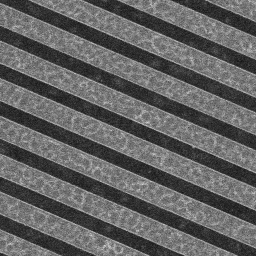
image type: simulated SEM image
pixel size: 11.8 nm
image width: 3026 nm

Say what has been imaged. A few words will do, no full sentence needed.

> parallel lines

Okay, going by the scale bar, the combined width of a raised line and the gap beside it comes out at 34.7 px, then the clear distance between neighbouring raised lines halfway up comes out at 170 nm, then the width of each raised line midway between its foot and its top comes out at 244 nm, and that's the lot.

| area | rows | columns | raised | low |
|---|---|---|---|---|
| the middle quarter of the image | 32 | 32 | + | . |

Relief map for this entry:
........+++++++++++++.........++
+.........+++++++++++++.........
+++.........+++++++++++++.......
+++++..........+++++++++++++....
++++++++.........+++++++++++++..
++++++++++.........+++++++++++++
++++++++++++..........++++++++++
..+++++++++++++.........++++++++
.....++++++++++++.........++++++
.......++++++++++++..........+++
.........+++++++++++++.........+
++..........++++++++++++........
+++++.........+++++..+++++......
+++++++.........+++.+.+++++++...
+++++++++..........+.++++++++++.
++++++++++++.........+++++++++++
.+++++++++++++.........+++++++++
...+++++++++++++..........++++++
......+++++++++++++.........++++
........+++++++++++++.........++
+.........+++++++++++++.........
+++..........+++++++++++++......
++++++.........+++++++++++++....
++++++++.........+++++++++++++..
+++++++++++.........++++++++++++
+++++++++++++.........++++++++++
...+++++++++++++........++++++++
.....++++++++++++..........+++++
.......+++++++++++++.........+++
..........++++++++++++.........+
+++.........++++++++++++........
+++++.........+++++++++++++.....